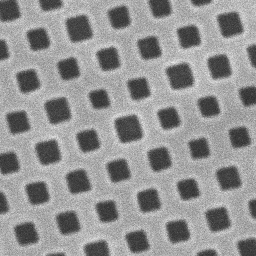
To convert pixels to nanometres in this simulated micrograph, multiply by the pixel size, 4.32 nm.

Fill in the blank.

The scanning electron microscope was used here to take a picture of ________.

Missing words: a regular array of holes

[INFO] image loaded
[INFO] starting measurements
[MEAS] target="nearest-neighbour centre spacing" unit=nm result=179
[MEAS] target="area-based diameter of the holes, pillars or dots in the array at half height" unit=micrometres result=0.109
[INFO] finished